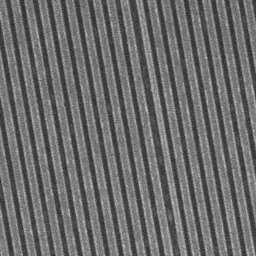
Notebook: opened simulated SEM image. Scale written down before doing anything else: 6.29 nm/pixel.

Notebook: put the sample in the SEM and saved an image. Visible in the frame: parallel lines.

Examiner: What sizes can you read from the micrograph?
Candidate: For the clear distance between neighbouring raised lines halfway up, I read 0.0341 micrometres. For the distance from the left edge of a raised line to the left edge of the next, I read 84.8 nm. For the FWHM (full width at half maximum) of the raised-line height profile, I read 51.2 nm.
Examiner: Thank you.